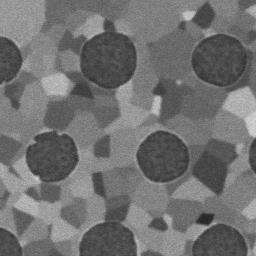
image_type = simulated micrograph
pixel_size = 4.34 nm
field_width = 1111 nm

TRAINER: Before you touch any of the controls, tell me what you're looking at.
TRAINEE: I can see holes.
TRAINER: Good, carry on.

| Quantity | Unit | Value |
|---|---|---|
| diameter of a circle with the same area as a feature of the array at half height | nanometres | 235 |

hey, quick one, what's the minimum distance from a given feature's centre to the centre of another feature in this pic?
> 0.48 micrometres